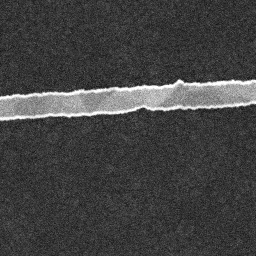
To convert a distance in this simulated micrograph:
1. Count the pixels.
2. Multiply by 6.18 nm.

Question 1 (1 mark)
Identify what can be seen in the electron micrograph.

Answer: one or a few lines or trenches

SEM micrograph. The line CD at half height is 140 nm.